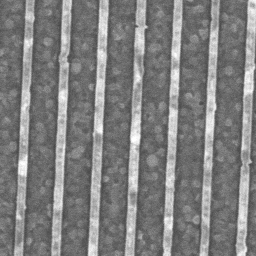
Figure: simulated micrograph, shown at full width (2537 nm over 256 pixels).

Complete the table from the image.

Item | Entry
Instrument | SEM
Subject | parallel lines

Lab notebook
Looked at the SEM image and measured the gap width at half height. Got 29.7 px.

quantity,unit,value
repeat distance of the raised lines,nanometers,367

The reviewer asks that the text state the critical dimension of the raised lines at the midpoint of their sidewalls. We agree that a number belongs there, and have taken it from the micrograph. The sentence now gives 0.0755 um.